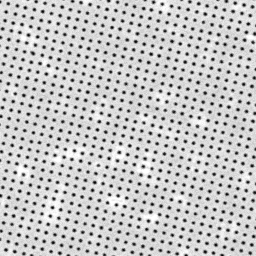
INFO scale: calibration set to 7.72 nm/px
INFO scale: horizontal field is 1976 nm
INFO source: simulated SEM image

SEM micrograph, a regular array of holes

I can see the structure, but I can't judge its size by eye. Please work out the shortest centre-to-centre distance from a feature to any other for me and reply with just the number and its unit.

64 nanometers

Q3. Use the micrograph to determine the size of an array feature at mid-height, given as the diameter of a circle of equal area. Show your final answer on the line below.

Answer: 0.0314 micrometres